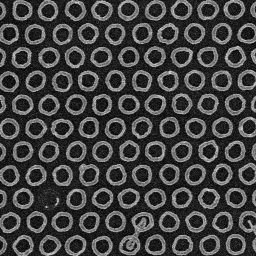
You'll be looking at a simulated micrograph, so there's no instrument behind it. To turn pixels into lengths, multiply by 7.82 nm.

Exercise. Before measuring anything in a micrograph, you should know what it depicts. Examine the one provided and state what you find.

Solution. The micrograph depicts a regular array of ring-shaped raised bodies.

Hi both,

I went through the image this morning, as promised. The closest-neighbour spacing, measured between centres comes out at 202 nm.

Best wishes